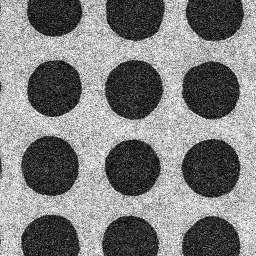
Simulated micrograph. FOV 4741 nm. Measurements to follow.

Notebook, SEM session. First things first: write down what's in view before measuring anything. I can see holes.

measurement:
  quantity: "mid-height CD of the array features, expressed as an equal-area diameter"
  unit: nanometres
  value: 1080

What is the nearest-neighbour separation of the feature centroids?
1440 nm